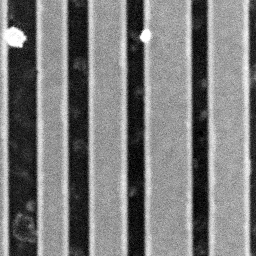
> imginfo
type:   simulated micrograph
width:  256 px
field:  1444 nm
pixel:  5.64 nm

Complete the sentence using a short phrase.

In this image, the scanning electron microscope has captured one or a few lines or trenches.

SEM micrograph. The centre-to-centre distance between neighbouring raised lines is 58.8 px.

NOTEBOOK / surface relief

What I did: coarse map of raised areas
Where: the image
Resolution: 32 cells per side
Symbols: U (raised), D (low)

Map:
UDDDDUUUDDDUUUUDDDUUUUUUDDUUUUUD
UDDDDUUUDDDUUUUDDDUUUUUUDDUUUUUD
UDDDDUUUDDDUUUUDDDUUUUUUDDUUUUUD
UDDDDUUUDDDUUUUDDDUUUUUUDDUUUUUD
UDDDDUUUDDDUUUUDDDUUUUUUDDUUUUUD
UDDDDUUUDDDUUUUDDDUUUUUUDDUUUUUD
UDDDDUUUDDDUUUUDDDUUUUUUDDUUUUUD
UDDDDUUUDDDUUUUDDDUUUUUUDDUUUUUD
UDDDDUUUDDDUUUUDDDUUUUUUDDUUUUUD
UDDDDUUUDDDUUUUDDDUUUUUUDDUUUUUD
UDDDDUUUDDDUUUUDDDUUUUUUDDUUUUUD
UDDDDUUUDDDUUUUDDDUUUUUUDDUUUUUD
UDDDDUUUDDDUUUUDDDUUUUUUDDUUUUUD
UDDDDUUUDDDUUUUDDDUUUUUUDDUUUUUD
UDDDDUUUDDDUUUUDDDUUUUUUDDUUUUUD
UDDDDUUUDDDUUUUDDDUUUUUUDDUUUUUD
UDDDDUUUDDDUUUUDDDUUUUUUDDUUUUUD
UDDDDUUUDDDUUUUUDDUUUUUUDDUUUUUD
UDDDDUUUDDDUUUUUDDUUUUUUDDUUUUUD
UDDDDUUUDDDUUUUUDDUUUUUUDDUUUUUD
UDDDDUUUDDDUUUUUDDUUUUUUDDUUUUUD
UDDDDUUUDDDUUUUUDDUUUUUUDDUUUUUD
UDDDDUUUDDDUUUUUDDUUUUUUDDUUUUUD
UDDDDUUUDDDUUUUUDDUUUUUUDDUUUUUD
UDDDDUUUDDDUUUUUDDUUUUUUDDUUUUUD
UDDDDUUUDDDUUUUUDDUUUUUUDDUUUUUD
UDDDDUUUDDDUUUUUDDUUUUUUDDUUUUUD
UDDDDUUUDDDUUUUUDDUUUUUUDDUUUUUD
UDDDDUUUDDDUUUUUDDUUUUUUDDUUUUUD
UDDDDUUUDDDUUUUUDDUUUUUUDDUUUUUD
UDDDDUUUDDDUUUUUDDUUUUUUDDUUUUUD
UDDDDUUUDDDUUUUUDDDUUUUUDDUUUUUD